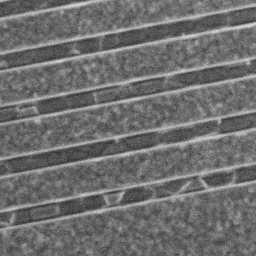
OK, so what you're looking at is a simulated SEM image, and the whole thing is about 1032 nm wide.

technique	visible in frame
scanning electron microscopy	parallel lines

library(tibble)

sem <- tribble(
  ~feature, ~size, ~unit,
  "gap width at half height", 67.3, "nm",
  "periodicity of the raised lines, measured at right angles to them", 208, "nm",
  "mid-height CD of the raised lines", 143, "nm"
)